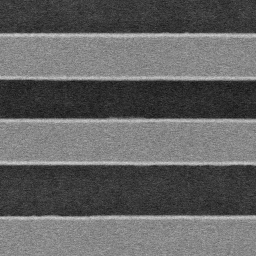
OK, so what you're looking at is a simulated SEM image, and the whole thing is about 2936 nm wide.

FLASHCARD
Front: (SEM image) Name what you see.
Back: lines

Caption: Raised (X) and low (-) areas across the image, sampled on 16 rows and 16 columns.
----------------
----------------
XXXXXXXXXXXXXXXX
XXXXXXXXXXXXXXXX
XXXXXXXXXXXXXXXX
----------------
----------------
XXXXXXXXXXXXXXXX
XXXXXXXXXXXXXXXX
XXXXXXXXXXXXXXXX
----------------
----------------
----------------
----------------
XXXXXXXXXXXXXXXX
XXXXXXXXXXXXXXXX